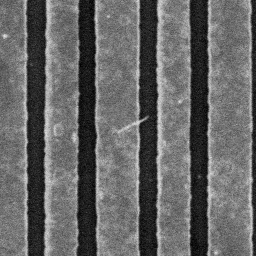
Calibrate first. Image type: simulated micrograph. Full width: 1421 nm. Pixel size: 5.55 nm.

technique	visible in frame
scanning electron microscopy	lines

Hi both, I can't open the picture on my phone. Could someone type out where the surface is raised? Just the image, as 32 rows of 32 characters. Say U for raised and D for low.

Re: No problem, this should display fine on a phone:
UUUDDDUUUUDDUUUUUDDDUUUUDDUUUUUD
UUUDDDUUUUDDUUUUUDDDUUUUDDUUUUUD
UUUDDDUUUUDDUUUUUDDDUUUUDDUUUUUD
UUUDDDUUUUDDUUUUUDDDUUUUDDUUUUUD
UUUDDDUUUUDDUUUUUDDDUUUUDDUUUUUD
UUUDDDUUUUDDUUUUUDDDUUUUDDUUUUUD
UUUDDDUUUUDDUUUUUDDDUUUUDDUUUUUD
UUUDDDUUUUDDUUUUUDDDUUUUDDUUUUUD
UUUDDDUUUUDDUUUUUDDDUUUUDDUUUUUD
UUUDDDUUUUDDUUUUUDDDUUUUDDUUUUUD
UUUDDDUUUUDDUUUUUDDDUUUUDDUUUUUD
UUUDDDUUUUDDUUUUUDDDUUUUDDUUUUUD
UUUDDDUUUUDDUUUUUDDDUUUUDDUUUUUD
UUUDDDUUUUDDUUUUUDDDUUUUDDUUUUUD
UUUDDDUUUUDDUUUUUDDDUUUUDDUUUUUD
UUUDDDUUUUDDUUUUUDDDUUUUDDUUUUUD
UUUDDDUUUUDDUUUUUDDDUUUUDDUUUUUD
UUUDDDUUUUDDUUUUUDDDUUUUDDUUUUUD
UUUDDDUUUUDDUUUUUDDDUUUUDDUUUUUD
UUUDDDUUUUDDUUUUUDDDUUUUDDUUUUUD
UUUDDDUUUUDDUUUUUDDDUUUUDDUUUUUD
UUUDDDUUUUDDUUUUUDDDUUUUDDUUUUUD
UUUDDDUUUUDDUUUUUDDDUUUUDDUUUUUD
UUUDDDUUUUDDUUUUUDDDUUUUDDUUUUUD
UUUDDDUUUUDDUUUUUDDDUUUUDDUUUUUD
UUUDDDUUUUDDUUUUUDDDUUUUDDUUUUUD
UUUDDDUUUUDDUUUUUDDDUUUUDDUUUUUD
UUUDDDUUUUDDUUUUUDDDUUUUDDUUUUUD
UUUDDDUUUUDDUUUUUDDDUUUUDDUUUUUD
UUUDDDUUUUDDUUUUUDDDUUUUDDUUUUUD
UUUDDDUUUUDDUUUUUDDDUUUUDDUUUUUD
UUUDDDUUUDDDUUUUUDDDUUUUDDUUUUUD